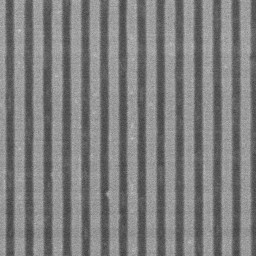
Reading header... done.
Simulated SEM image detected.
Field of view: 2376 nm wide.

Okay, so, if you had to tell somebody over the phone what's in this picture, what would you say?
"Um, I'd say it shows parallel lines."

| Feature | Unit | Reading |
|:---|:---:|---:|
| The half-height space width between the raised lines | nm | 82.3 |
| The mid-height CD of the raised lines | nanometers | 90.5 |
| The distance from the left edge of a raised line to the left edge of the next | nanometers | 175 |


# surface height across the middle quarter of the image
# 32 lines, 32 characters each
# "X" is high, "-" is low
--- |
--XX---XX--XXX--XX---XX--XXX--XX
--XX---XX--XXX--XX---XX--XXX--XX
--XX---XX--XXX--XX---XX--XXX--XX
--XX---XX--XXX--XX---XX--XXX--XX
--XX---XX--XXX--XX---XX--XXX--XX
--XX---XX--XX---XX---XX--XXX--XX
--XX---XX--XXX--XX---XX--XXX--XX
--XX---XX--XXX--XX---XX--XXX--XX
--XX---XX--XXX--XX---XX--XXX--XX
--XX--XXX--XXX--XX---XX--XXX--XX
--XX--XXX--XXX--XX---XX--XXX--XX
--XX---XX--XXX--XX---XX--XXX--XX
--XX---XX--XXX--XX---XX--XXX--XX
--XX---XX--XXX--XX---XX--XXX--XX
--XX---XX--XXX--XX---XX--XXX--XX
--XX---XX--XXX--XX---XX--XXX--XX
--XX---XX--XXX--XX---XX--XXX--XX
--XX---XX--XXX--XX---XX--XXX--XX
--XX---XX--XXX--XX---XX--XXX--XX
--XX---XX--XXX--XX---XX--XXX--XX
--XX---XX--XXX--XX---XX--XXX--XX
--XX---XX--XXX--XX---XX--XXX--XX
--XX---XX--XXX--XX---XX--XXX--XX
--XX---XX--XXX--XX---XX--XXX--XX
--XX---XX--XXX--XX---XX--XXX--XX
--XX---XX--XXX--XX---XX--XXX--XX
--XX---XX--XXX--XX---XX--XXX--XX
--XX---XX--XXX--XX---XX--XXX--XX
--XX---XX--XXX--XX---XX--XXX--XX
--XX---XX--XXX--XX---XX--XXX--XX
--XX---XX--XXX--XX---XX--XXX--XX
--XX---XX--XXX--XX---XX--XXX--XX